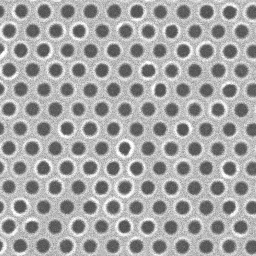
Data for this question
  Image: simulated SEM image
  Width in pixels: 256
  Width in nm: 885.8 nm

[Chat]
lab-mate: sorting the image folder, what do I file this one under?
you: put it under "a regular array of holes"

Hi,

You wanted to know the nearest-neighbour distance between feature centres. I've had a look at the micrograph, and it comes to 22.5 pixels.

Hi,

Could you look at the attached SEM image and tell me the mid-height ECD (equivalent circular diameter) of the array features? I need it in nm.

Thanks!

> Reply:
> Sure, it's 50.1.